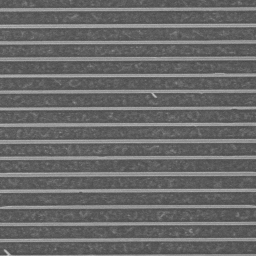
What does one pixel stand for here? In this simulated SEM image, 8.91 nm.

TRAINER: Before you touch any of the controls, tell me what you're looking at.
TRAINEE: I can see parallel lines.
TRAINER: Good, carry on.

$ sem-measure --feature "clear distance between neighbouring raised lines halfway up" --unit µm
0.118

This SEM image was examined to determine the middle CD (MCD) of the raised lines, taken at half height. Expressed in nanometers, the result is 25.6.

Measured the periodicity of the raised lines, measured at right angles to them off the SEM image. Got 147 nm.